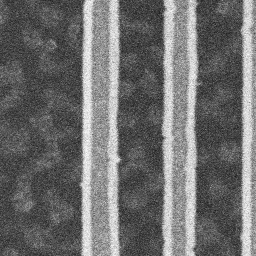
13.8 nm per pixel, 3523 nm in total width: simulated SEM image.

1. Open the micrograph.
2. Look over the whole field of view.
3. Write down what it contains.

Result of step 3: one or a few lines or trenches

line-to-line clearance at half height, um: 0.764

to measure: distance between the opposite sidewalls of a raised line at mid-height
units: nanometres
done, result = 342